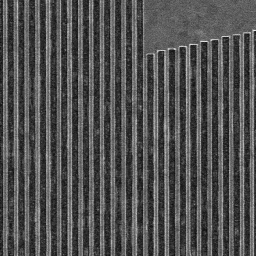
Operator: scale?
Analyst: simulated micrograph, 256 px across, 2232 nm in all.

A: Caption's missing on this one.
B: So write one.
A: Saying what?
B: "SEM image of parallel lines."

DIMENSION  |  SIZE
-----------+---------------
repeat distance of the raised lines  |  93.6 nm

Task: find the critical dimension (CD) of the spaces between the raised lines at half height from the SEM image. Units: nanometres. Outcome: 59.9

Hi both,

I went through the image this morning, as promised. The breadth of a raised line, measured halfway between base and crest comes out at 30.5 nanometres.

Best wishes